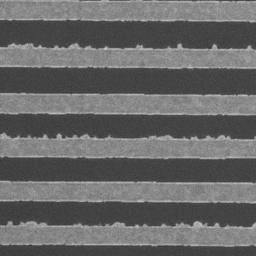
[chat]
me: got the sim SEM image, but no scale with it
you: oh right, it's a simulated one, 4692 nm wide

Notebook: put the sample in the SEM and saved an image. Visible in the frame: lines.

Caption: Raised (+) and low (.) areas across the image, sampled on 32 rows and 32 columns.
++++++++++++++++++++++++++++++++
++++++++++++++++++++++++++++++++
...............+++++++.+++++++++
................................
................................
................................
++++++++++++++++++++++++++++++++
++++++++++++++++++++++++++++++++
.....................+++....++++
................................
................................
................................
++++++++++++++++++++++++++++++++
++++++++++++++++++++++++++++++++
................................
................................
................................
+++++++++++++++++++++++++++++..+
++++++++++++++++++++++++++++++++
++++++++++++++++++++++++++++++++
................................
................................
................................
++++++++++++++++++++++++++++++++
++++++++++++++++++++++++++++++++
................................
................................
................................
++++++++++++++++++++++++++++++++
++++++++++++++++++++++++++++++++
++..+...++++++++++++++++++++++++
................................